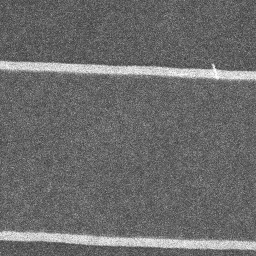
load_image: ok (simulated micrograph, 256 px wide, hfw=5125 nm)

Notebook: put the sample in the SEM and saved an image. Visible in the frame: one or a few lines or trenches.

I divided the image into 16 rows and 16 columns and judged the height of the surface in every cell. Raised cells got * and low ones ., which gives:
................
................
................
................
***********.....
****************
****************
****************
****************
****************
****************
****************
****************
****************
****************
................